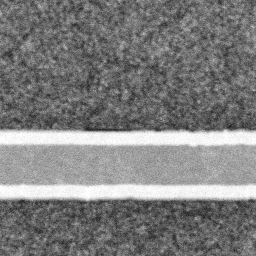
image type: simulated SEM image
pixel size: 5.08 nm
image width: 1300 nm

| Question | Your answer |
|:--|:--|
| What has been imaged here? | one or a few lines or trenches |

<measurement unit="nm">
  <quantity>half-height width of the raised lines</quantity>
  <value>278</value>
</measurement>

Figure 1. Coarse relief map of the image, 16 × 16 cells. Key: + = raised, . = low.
................
................
................
................
................
................
................
................
................
++++++++++++++++
++++++++++++++++
++++++++++++++++
................
................
................
................